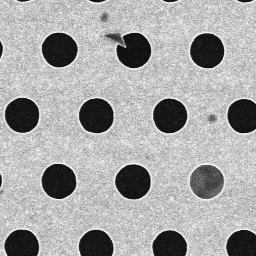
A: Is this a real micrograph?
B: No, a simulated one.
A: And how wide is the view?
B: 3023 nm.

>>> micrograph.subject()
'a regular array of holes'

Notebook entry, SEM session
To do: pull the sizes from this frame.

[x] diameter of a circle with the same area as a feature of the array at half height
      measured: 413 nanometres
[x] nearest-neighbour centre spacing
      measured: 870 nm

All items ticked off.